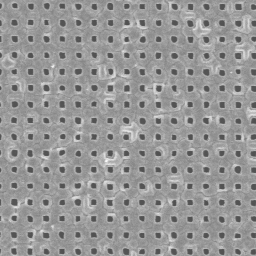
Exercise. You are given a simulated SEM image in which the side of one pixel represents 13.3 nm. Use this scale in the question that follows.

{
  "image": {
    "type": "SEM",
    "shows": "a regular array of holes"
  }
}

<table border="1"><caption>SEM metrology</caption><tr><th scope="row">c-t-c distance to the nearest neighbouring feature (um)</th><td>0.21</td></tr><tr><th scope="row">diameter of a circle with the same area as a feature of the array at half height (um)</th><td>0.0811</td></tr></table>